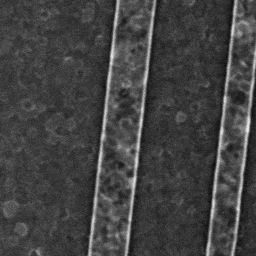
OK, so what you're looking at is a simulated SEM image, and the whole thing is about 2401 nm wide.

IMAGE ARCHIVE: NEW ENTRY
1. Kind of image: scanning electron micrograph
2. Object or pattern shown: one or a few lines or trenches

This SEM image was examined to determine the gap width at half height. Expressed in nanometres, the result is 750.